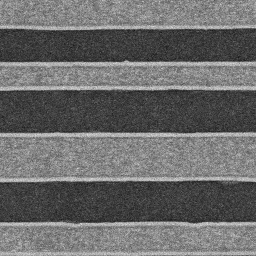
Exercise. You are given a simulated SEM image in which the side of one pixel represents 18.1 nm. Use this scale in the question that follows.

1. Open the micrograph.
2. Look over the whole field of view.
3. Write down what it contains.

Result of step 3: one or a few lines or trenches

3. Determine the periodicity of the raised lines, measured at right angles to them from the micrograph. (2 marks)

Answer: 1470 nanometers